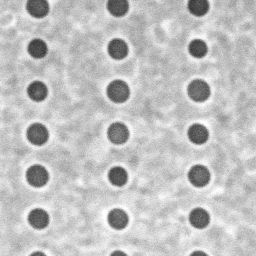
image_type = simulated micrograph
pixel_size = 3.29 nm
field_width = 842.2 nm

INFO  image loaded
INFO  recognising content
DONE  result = a regular array of holes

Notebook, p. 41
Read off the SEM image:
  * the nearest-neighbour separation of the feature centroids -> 0.139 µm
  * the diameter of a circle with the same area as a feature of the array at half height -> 78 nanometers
